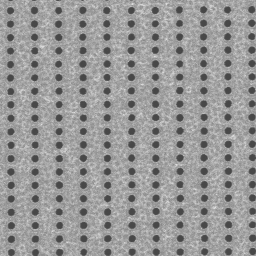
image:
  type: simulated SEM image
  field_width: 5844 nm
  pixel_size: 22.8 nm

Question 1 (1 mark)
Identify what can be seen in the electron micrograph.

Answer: a regular array of holes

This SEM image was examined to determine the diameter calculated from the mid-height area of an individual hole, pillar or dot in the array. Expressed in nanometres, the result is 171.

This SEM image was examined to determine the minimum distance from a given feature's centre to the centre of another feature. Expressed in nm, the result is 304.